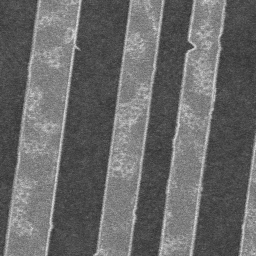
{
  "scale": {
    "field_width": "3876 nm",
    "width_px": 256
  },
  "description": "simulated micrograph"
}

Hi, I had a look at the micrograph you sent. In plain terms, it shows one or a few lines or trenches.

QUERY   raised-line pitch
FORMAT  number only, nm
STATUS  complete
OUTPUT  1120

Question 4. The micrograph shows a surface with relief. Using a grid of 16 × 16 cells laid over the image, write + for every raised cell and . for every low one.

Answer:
..+++...++..++..
..+++...++..++..
..+++...++..++..
..+++...++..++..
..++....++..+...
..++...++..++...
..++...++..++...
.+++...++..++...
.+++...++..++...
.+++...++..++...
.+++...++..++...
.++....++..+....
.++....++.++...+
.++...++..++...+
.++...++..++...+
+++...++..++...+